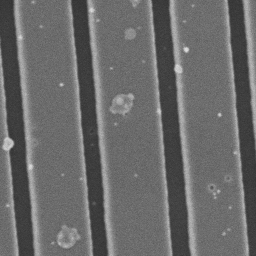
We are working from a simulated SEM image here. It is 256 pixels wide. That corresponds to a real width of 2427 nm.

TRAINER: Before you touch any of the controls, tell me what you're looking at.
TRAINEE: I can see lines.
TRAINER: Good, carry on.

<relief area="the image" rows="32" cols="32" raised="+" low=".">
..+++++++..++++++++..+++++++..++
..+++++++..++++++++..+++++++...+
..+++++++..++++++++..++++++++..+
..+++++++..++++++++..++++++++..+
..+++++++..++++++++...+++++++..+
..+++++++..++++++++...+++++++..+
..+++++++..++++++++...+++++++..+
..+++++++...+++++++...+++++++..+
..++++++++..++++++++..+++++++..+
...+++++++..++++++++..+++++++..+
...+++++++..++++++++..+++++++..+
+..+++++++..++++++++..+++++++..+
+..+++++++..++++++++..+++++++..+
+..+++++++..++++++++..++++++++.+
+..+++++++..++++++++..++++++++..
+..+++++++..++++++++...+++++++..
+..+++++++..++++++++...+++++++..
+..+++++++..++++++++...+++++++..
+..+++++++..++++++++...+++++++..
+..++++++++..++++++++..+++++++..
+..++++++++..++++++++..+++++++..
+..++++++++..++++++++..+++++++..
+...+++++++..++++++++..+++++++..
++..+++++++..++++++++..+++++++..
++..+++++++..++++++++..+++++++..
++..+++++++..++++++++..++++++++.
++..+++++++..++++++++...+++++++.
++..+++++++..++++++++...+++++++.
++..+++++++..++++++++...+++++++.
++..+++++++..++++++++...+++++++.
++..+++++++..++++++++...+++++++.
++..++++++++..+++++++...+++++++.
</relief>